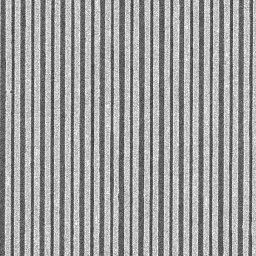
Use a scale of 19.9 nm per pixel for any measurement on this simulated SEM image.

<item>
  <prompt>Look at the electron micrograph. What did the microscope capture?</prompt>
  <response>parallel lines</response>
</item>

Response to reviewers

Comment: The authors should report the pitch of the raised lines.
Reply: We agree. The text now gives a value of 0.197 um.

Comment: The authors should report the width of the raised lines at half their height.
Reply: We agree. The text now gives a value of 0.112 microns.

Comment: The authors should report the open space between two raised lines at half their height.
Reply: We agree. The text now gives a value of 0.0771 microns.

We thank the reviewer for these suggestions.